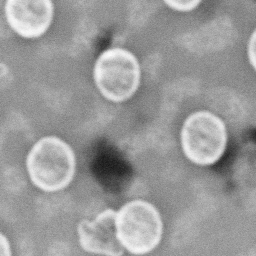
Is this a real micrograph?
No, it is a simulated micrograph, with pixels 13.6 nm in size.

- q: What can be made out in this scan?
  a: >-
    raised bodies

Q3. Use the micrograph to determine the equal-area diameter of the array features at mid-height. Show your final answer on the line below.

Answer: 624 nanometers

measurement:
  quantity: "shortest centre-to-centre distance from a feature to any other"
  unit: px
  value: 108